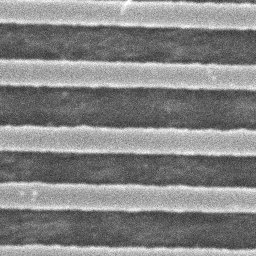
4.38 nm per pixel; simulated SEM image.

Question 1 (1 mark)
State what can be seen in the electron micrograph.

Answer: lines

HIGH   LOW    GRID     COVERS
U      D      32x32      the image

UUUUUUUUUUUUUUUUUUUUUUUUUUUDDDDD
UUUUUUUUUUUUUUUUUUUUUUUUUUUUUUUU
UUUUUUUUUUUUUUUUUUUUUUUUUUUUUUUU
DDDDDDDDDDDDDDDDDDDDDDDDDDUUUUUU
DDDDDDDDDDDDDDDDDDDDDDDDDDDDDDDD
DDDDDDDDDDDDDDDDDDDDDDDDDDDDDDDD
DDDDDDDDDDDDDDDDDDDDDDDDDDDDDDDD
DDDDDDDDDDDDDDDDDDDDDDDDDDDDDDDD
UUUUUUUUUUUUUUUUUUUUUUUUUUUUUUUU
UUUUUUUUUUUUUUUUUUUUUUUUUUUUUUUU
DUUUUUUUUUUUUUUUUUUUUUUUUUUUUUUU
DDDDDDDDDDDDDDDDDDDDDDDDDDDDDDDD
DDDDDDDDDDDDDDDDDDDDDDDDDDDDDDDD
DDDDDDDDDDDDDDDDDDDDDDDDDDDDDDDD
DDDDDDDDDDDDDDDDDDDDDDDDDDDDDDDD
DDDDDDDDDDDDDDDDDDDDDDDDDDDDDDDD
UUUUUUUUUUUUUUUUUUUUUUUUUUUUUUUU
UUUUUUUUUUUUUUUUUUUUUUUUUUUUUUUU
UUUUUUUUUUUUUUUUUUUUUUUUUUUUUUUU
DDDDDDDDDDDDDDDDDDDDDDDDDDDDDDDD
DDDDDDDDDDDDDDDDDDDDDDDDDDDDDDDD
DDDDDDDDDDDDDDDDDDDDDDDDDDDDDDDD
DDDDDDDDDDDDDDDDDDDDDDDDDDDDDDDD
UUUUUUUUUUUUUUUUUUUUUUUUDDDDDDDD
UUUUUUUUUUUUUUUUUUUUUUUUUUUUUUUU
UUUUUUUUUUUUUUUUUUUUUUUUUUUUUUUU
DDDDDDDDDDDDDDDDDDDDDDDDDDDDDDDD
DDDDDDDDDDDDDDDDDDDDDDDDDDDDDDDD
DDDDDDDDDDDDDDDDDDDDDDDDDDDDDDDD
DDDDDDDDDDDDDDDDDDDDDDDDDDDDDDDD
DDDDDDDDDDDDDDDDDDDDDDDDDDDDDDDD
UUUUUUUUUUUUUUUUUUUUUUUUUUUUUUUU